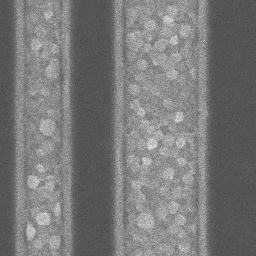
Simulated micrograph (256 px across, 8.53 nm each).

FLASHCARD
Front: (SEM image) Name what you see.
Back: one or a few lines or trenches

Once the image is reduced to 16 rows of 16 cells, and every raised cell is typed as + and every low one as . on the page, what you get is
+...+++......+++
+...+++......+++
+...+++......+++
+...++++.....+++
+...++++.....+++
+...++++.....+++
+...++++.....+++
+...+++......+++
+...+++......+++
+...+++......+++
+...++++.....+++
+...++++.....+++
+...++++.....+++
+...++++.....+++
+...+++......+++
+...++++.....+++